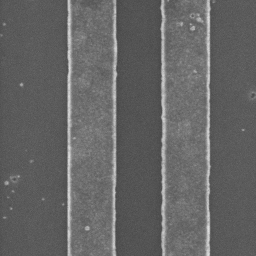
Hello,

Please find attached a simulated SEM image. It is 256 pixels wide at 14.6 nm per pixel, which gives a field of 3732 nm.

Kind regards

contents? lines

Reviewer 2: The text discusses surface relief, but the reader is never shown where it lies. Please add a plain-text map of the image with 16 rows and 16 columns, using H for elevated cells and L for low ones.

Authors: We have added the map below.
LLLLHHHLLLHHHLLL
LLLLHHHLLLHHHLLL
LLLLHHHLLLHHHLLL
LLLLHHHLLLHHHLLL
LLLLHHHLLLHHHLLL
LLLLHHHLLLHHHLLL
LLLLHHHLLLHHHLLL
LLLLHHHLLLHHHLLL
LLLLHHHLLLHHHLLL
LLLLHHHLLLHHHLLL
LLLLHHHLLLHHHLLL
LLLLHHHLLLHHHLLL
LLLLHHHLLLHHHLLL
LLLLHHHLLLHHHLLL
LLLLHHHLLLHHHLLL
LLLLHHHLLLHHHLLL